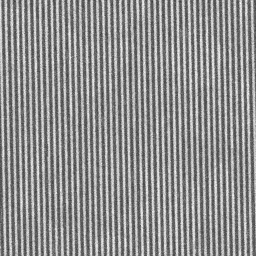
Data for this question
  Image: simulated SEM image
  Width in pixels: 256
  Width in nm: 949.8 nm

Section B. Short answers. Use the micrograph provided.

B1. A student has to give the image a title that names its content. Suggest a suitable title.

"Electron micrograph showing parallel lines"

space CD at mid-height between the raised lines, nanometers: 13.9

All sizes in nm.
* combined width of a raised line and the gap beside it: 21.2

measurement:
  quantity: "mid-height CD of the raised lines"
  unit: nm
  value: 7.9